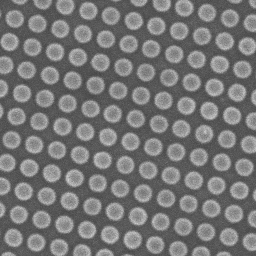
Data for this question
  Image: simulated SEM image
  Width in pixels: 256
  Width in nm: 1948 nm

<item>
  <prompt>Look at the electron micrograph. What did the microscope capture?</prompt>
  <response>a regular array of raised bodies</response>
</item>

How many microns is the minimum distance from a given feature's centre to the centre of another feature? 0.177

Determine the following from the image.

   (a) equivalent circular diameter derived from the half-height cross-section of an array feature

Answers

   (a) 129 nm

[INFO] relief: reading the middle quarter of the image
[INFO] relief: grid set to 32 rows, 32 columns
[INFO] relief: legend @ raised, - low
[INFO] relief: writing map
-------@@@@--@@@@--@@@----------
--------@@---@@@@-@@@@@---@-----
-@@-----------@@---@@@@-@@@@----
@@@@---@@----------@@@--@@@@--@@
@@@@--@@@@---------------@@@--@@
-@@@--@@@@--@@@---------------@@
------@@@@-@@@@@--@@@----------@
------------@@@@-@@@@---@@------
@@-----------@@--@@@@--@@@@---@-
@@@--@@@----------@@@--@@@@--@@@
@@@--@@@@---@----------@@@---@@@
@@---@@@@-@@@@---------------@@@
-----@@@--@@@@--@@@@------------
----------@@@@--@@@@--@@@-------
@---------------@@@@--@@@@--@@--
@@--@@@----------@@---@@@@-@@@@-
@@-@@@@---@@----------@@@--@@@@-
@--@@@@--@@@@---@-----------@@@-
----@@@--@@@@--@@@--------------
---------@@@@--@@@@--@@@--------
---------------@@@--@@@@---@@---
--@@@@----------@---@@@@--@@@@--
--@@@@--@@@----------@@@--@@@@--
--@@@@--@@@@--@@----------@@@---
---@@---@@@@--@@@---------------
--------@@@--@@@@--@@@@---------
--------------@@@--@@@@--@@@----
-@@@---------------@@@@--@@@@--@
-@@@@--@@@-----------@---@@@@--@
-@@@@-@@@@---@@-----------@@--@@
--@---@@@@--@@@@---@@----------@
-------@@@--@@@@--@@@@----------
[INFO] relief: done